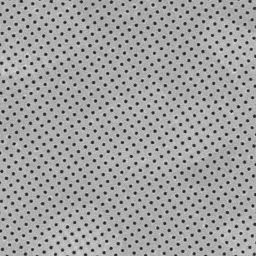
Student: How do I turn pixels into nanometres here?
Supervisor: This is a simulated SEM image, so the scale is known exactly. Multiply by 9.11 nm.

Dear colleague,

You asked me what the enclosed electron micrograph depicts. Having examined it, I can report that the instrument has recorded a regular array of holes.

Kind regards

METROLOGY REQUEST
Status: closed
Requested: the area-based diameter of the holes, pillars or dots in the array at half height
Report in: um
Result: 0.0308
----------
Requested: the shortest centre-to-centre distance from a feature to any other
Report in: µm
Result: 0.0733